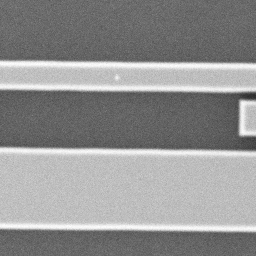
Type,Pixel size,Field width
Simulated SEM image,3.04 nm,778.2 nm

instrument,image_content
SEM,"groups of lines, slits or small figures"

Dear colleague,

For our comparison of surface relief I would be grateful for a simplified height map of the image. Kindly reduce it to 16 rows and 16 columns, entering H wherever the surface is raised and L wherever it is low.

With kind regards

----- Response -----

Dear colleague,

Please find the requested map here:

LLLLLLLLLLLLLLLL
LLLLLLLLLLLLLLLL
LLLLLLLLLLLLLLLL
LLLLLLLLLLLLLLLL
HHHHHHHHHHHHHHHH
HHHHHHHHHHHHHHHH
LLLLLLLLLLLLLLLH
LLLLLLLLLLLLLLLH
LLLLLLLLLLLLLLLL
HHHHHHHHHHHHHHHH
HHHHHHHHHHHHHHHH
HHHHHHHHHHHHHHHH
HHHHHHHHHHHHHHHH
HHHHHHHHHHHHHHHH
LLLLLLLLLLLLLLLL
LLLLLLLLLLLLLLLL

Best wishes